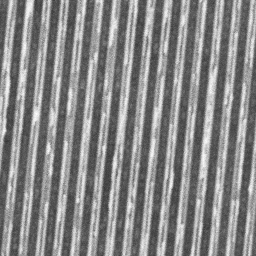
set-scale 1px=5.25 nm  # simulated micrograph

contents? parallel lines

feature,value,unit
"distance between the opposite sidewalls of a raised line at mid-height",8.08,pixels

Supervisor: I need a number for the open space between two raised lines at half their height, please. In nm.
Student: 47.6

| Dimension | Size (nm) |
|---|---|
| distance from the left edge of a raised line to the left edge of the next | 90.2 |